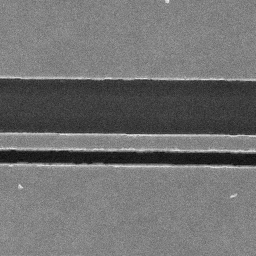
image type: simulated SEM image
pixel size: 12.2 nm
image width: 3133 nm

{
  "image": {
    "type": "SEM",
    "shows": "lines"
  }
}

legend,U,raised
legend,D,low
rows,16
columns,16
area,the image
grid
UUUUUUUUUUUUUUUU
UUUUUUUUUUUUUUUU
UUUUUUUUUUUUUUUU
UUUUUUUUUUUUUUUU
UUUUUUUUUUUUUUUU
DDDDDDDDDDDDDDDD
DDDDDDDDDDDDDDDD
DDDDDDDDDDDDDDDD
UUUUUUUUUUUUUUUU
UUUUUUUUUUUUUUUU
UUUUUUUUUUUUUUUU
UUUUUUUUUUUUUUUU
UUUUUUUUUUUUUUUU
UUUUUUUUUUUUUUUU
UUUUUUUUUUUUUUUU
UUUUUUUUUUUUUUUU